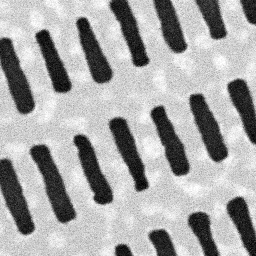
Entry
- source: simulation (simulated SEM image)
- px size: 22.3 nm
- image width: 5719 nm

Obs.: holes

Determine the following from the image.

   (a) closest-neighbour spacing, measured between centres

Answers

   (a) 907 nanometers